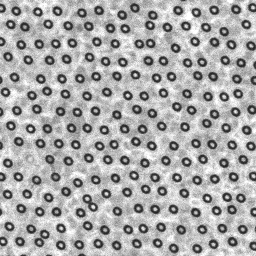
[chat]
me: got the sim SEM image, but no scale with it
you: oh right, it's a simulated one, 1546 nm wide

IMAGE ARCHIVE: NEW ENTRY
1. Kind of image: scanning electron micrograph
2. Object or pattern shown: a regular array of ring-shaped grooves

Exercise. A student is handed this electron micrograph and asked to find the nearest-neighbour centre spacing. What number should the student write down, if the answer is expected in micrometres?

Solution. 0.0985